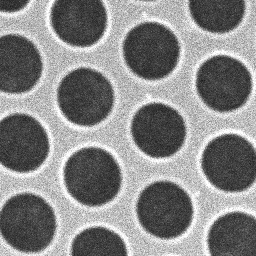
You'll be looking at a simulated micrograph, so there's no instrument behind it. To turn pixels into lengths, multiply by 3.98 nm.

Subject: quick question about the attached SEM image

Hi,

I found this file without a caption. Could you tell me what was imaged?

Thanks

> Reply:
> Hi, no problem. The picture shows holes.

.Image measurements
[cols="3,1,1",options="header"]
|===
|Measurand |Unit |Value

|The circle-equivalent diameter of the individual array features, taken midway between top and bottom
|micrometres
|0.23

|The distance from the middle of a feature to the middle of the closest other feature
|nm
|316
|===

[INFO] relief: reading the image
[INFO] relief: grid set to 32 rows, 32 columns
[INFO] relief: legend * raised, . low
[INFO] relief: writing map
...****......***********.......*
*.****.......***********.......*
******.......***********......**
*******......****....****....***
...****......***......**********
....****....***.......**********
.....**********.......**********
.....***********......****....**
.....*****.*****......***......*
.....***.....****....****......*
.....**.......**********.......*
...****.......***********......*
*******.......***********......*
*******.......****....****....**
*...****.....****......*********
.....****...****.......*********
......**********.......*********
......***********......****....*
......*****.*****......***......
......***.....*****..****.......
.....***.......**********.......
**..****.......**********.......
********.......***********......
********.......***.....****....*
**...****......**.......********
*.....****...****.......********
.......**********.......*****.**
.......**********.......***.....
.......****..*****.....***......
.......***.....****...****......
*.....***.......**********......
***..****.......**********......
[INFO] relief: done